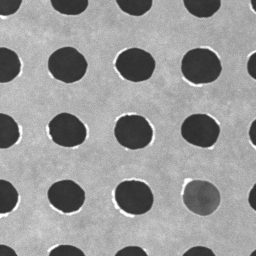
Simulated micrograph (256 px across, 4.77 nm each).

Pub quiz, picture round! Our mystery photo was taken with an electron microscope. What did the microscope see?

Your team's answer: a regular array of holes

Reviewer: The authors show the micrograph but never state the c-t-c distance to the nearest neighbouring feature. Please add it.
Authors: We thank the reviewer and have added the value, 312 nanometres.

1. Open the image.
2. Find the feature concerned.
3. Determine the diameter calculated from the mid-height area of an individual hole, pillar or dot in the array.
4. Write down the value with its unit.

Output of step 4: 174 nanometres